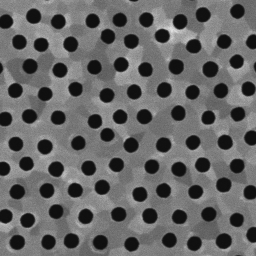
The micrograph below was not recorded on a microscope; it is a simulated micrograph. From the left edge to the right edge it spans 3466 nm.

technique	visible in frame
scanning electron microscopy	a regular array of holes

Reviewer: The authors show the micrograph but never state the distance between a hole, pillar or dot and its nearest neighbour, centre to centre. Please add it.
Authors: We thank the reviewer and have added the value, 334 nanometers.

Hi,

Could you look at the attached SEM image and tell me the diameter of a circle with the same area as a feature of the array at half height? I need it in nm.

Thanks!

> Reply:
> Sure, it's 200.